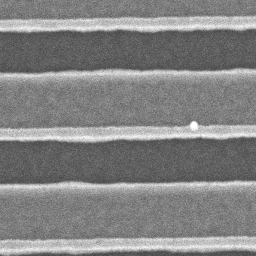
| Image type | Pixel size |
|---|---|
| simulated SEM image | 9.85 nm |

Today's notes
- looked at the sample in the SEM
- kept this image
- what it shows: lines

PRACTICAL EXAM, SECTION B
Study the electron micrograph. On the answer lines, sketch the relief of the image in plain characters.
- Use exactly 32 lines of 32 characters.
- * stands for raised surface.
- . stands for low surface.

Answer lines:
********************************
********************************
********************************
**************...***..*.........
................................
................................
................................
................................
................................
********************************
********************************
********************************
********************************
********************************
********************************
********************************
********************************
................................
................................
................................
................................
................................
................................
********************************
********************************
********************************
********************************
********************************
********************************
********************************
********************************
***.............................